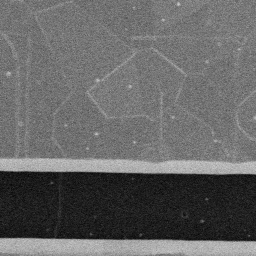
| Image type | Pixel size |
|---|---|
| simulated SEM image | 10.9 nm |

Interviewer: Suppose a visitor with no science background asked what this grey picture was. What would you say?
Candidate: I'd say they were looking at wiring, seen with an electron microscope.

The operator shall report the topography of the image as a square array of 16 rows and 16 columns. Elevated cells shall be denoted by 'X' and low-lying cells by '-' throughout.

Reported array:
XXXXXXXXXXXXXXXX
XXXXXXXXXXXXXXXX
XXXXXXXXXXXXXXXX
XXXXXXXXXXXXXXXX
XXXXXXXXXXXXXXXX
XXXXXXXXXXXXXXXX
XXXXXXXXXXXXXXXX
XXXXXXXXXXXXXXXX
XXXXXXXXXXXXXXXX
XXXXXXXXXXXXXXXX
----------------
----------------
----------------
----------------
----------------
XXXXXXXXXXXXXXX-